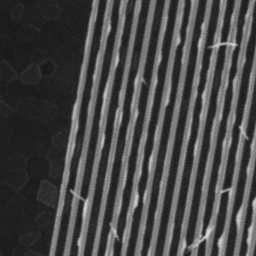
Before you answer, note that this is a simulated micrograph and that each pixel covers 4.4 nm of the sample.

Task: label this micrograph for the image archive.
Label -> parallel lines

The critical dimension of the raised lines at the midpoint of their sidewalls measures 26.1 nm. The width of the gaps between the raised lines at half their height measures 34.2 nm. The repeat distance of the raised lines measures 61.3 nanometers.